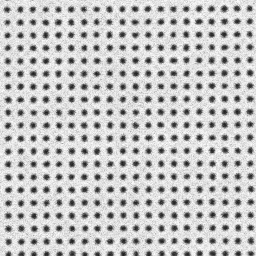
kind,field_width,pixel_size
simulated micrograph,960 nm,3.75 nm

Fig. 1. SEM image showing a regular array of holes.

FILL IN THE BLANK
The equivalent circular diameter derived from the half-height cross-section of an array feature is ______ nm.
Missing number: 24.7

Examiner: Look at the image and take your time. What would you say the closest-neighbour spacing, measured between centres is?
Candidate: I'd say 46.4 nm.